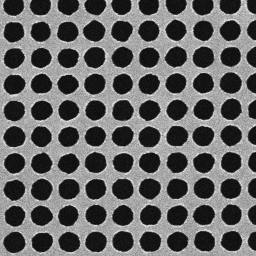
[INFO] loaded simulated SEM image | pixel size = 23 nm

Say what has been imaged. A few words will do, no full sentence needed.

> a regular array of holes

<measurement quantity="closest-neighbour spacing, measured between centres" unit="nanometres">602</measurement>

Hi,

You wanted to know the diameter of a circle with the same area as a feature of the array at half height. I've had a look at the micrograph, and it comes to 483 nm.